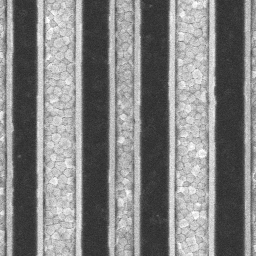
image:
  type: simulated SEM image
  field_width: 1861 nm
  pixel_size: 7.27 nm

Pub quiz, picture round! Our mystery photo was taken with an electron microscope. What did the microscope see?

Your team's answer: one or a few lines or trenches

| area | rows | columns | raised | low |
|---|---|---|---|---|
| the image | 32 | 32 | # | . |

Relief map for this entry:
.####.....####...#####.....####.
.####.....####...#####.....####.
.####.....####...#####.....####.
.####.....####...#####.....####.
.####.....####...#####....#####.
.####.....####...#####....#####.
.####.....####...#####....#####.
.####.....####...#####....#####.
.####.....####...#####....#####.
.####.....####...#####....#####.
.####.....####...#####....#####.
.####.....####...#####....#####.
.####.....####...#####....#####.
.####.....####...#####....#####.
.####.....####...#####....#####.
.####.....####...#####....#####.
.####.....####...#####....#####.
.####.....####...#####....#####.
.####.....####...#####....#####.
.####.....####...#####....#####.
.####.....####...#####....#####.
.####.....####...#####.....####.
.####.....####...#####.....####.
.####.....####...#####.....####.
.####.....####...####......####.
.####.....####...####......####.
.####.....####...####.....#####.
.####.....####...####.....#####.
.####.....####...####.....#####.
.####.....####...####.....#####.
.####.....####...####.....#####.
.####.....####...####.....#####.